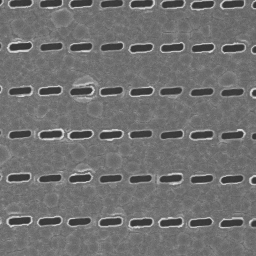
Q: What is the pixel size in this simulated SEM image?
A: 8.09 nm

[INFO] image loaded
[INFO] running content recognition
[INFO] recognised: a regular array of holes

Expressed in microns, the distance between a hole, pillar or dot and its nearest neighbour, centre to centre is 0.244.